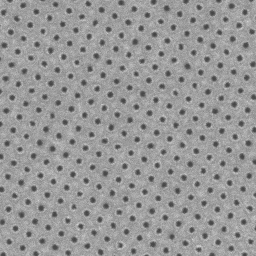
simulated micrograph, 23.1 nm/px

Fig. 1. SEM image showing a regular array of holes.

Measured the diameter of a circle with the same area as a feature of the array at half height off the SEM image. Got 152 nanometres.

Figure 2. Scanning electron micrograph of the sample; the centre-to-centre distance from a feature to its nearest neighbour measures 333 nm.